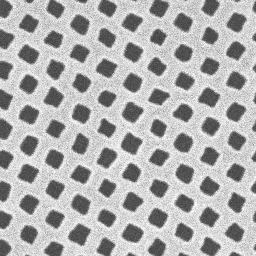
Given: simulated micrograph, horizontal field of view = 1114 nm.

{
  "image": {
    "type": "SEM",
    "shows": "a regular array of holes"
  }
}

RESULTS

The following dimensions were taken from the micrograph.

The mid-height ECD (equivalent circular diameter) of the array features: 78.6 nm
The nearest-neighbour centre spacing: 126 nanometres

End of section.